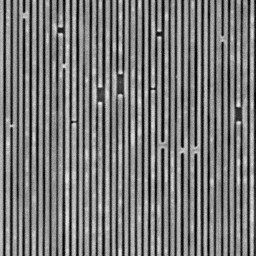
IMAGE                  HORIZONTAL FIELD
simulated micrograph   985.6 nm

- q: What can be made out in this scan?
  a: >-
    parallel lines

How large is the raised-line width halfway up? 16.4 nm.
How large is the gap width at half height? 0.0096 µm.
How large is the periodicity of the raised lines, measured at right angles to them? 0.0254 µm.